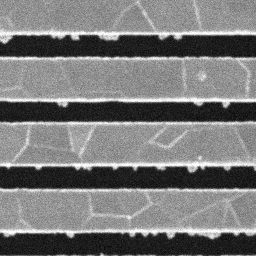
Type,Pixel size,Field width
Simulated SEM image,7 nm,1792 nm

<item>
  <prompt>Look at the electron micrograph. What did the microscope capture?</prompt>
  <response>lines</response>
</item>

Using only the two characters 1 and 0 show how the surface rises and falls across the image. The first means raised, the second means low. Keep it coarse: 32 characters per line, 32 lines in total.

11111111111111111111111111111111
11111111111111111111111111111111
11111111111111111111111111111111
11111111111111111111111111111111
00000000000000000000000000000000
00000000000000000000000000000000
00000000000000000000000000000000
11111111111111111111111111111111
11111111111111111111111111111111
11111111111111111111111111111111
11111111111111111111111111111111
11111111111111111111111111111111
11111111111111111111111111111111
00000000000000000000000000000000
00000000000000000000000000000000
11111111111111111111111111111111
11111111111111111111111111111111
11111111111111111111111111111111
11111111111111111111111111111111
11111111111111111111111111111111
11111111111111111111111111111111
00000000000000000000000000000000
00000000000000000000000000000000
00000000000000000000000000000000
11111111111111111111111111111111
11111111111111111111111111111111
11111111111111111111111111111111
11111111111111111111111111111111
11111111111111111111111111111111
00000000000000000000000000000000
00000000000000000000000000000000
00000000000000000000000000000000